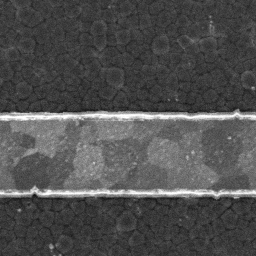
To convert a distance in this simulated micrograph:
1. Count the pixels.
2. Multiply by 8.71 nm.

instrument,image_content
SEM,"one or a few lines or trenches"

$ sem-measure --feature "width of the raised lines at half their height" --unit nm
671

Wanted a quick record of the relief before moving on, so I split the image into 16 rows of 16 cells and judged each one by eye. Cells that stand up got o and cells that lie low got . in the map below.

................
................
................
................
................
................
................
oooooooooooooooo
oooooooooooooooo
oooooooooooooooo
oooooooooooooooo
oooooooooooooooo
................
................
................
................